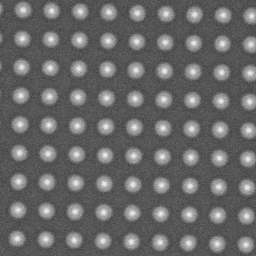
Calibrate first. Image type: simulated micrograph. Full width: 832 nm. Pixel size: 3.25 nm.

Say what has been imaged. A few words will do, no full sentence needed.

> an array of small figures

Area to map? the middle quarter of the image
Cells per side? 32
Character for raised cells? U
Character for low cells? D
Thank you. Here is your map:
DDUUUUDDDUUUUDDDUUUUDDDDUUUDDDDU
DDUUUUDDDUUUUDDDUUUUDDDUUUUDDDUU
DDUUUDDDDUUUDDDDUUUUDDDUUUUDDDUU
DDDDDDDDDDDDDDDDDDDDDDDDUUDDDDDU
DDDDDDDDDDDDDDDDDDDDDDDDDDDDDDDD
DDDDDDDDDDDDDDDDDDDDDDDDDDDDDDDD
DDDUDDDDDDDDDDDDDDDDDDDDDDDDDDDD
DDUUUDDDDUUUDDDDUUUDDDDDUUDDDDDU
DDUUUDDDDUUUUDDDUUUUDDDUUUUDDDUU
DDUUUDDDDUUUDDDDUUUUDDDUUUUDDDUU
DDDDDDDDDDDDDDDDDUUDDDDDUUDDDDDU
DDDDDDDDDDDDDDDDDDDDDDDDDDDDDDDD
DDDDDDDDDDDDDDDDDDDDDDDDDDDDDDDD
DDDDDDDDDDDDDDDDDDDDDDDDDDDDDDDD
DDUUUDDDDUUUDDDDUUUDDDDUUUDDDDDU
DUUUUDDDDUUUDDDDUUUUDDDUUUUDDDUU
DDUUUDDDDUUUDDDDUUUDDDDUUUUDDDUU
DDDDDDDDDDUDDDDDDUUDDDDDUUDDDDUU
DDDDDDDDDDDDDDDDDDDDDDDDDDDDDDDD
DDDDDDDDDDDDDDDDDDDDDDDDDDDDDDDD
DDDDDDDDDDDDDDDDDDDDDDDDDDDDDDDD
DDUUUDDDDUUUDDDDUUUDDDDDUDDDDDDU
DUUUUDDDDUUUDDDDUUUDDDDUUUDDDDUU
DUUUUDDDUUUUDDDDUUUDDDDUUUDDDDUU
DDDUDDDDDUUDDDDDUUUDDDDUUUDDDDUU
DDDDDDDDDDDDDDDDDDDDDDDDDDDDDDDD
DDDDDDDDDDDDDDDDDDDDDDDDDDDDDDDD
DDDDDDDDDDDDDDDDDDDDDDDDDDDDDDDD
DUUUDDDDDUUDDDDDUUDDDDDDDDDDDDDD
DUUUUDDDUUUUDDDUUUUDDDDUUUDDDDUU
DUUUUDDDUUUUDDDUUUUDDDUUUUDDDDUU
DDUUDDDDDUUDDDDDUUUDDDDUUUDDDDUU